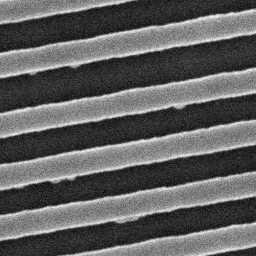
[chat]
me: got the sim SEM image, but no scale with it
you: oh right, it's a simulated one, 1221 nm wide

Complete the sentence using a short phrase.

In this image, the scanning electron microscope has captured lines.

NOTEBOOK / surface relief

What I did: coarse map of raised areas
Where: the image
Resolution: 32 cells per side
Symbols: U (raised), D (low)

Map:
UUUUUUUUUUUUUUDDDDDDDDDDDDDDDDDD
UUUUUUUUUDDDDDDDDDDDDDDDDDDDDDUU
UUUDDDDDDDDDDDDDDDDDDDDDUUUUUUUU
DDDDDDDDDDDDDDDDDDUUUUUUUUUUUUUU
DDDDDDDDDDDDDUUUUUUUUUUUUUUUUUDD
DDDDDDDUUUUUUUUUUUUUUUUUDDDDDDDD
DUUUUUUUUUUUUUUUUUDDDDDDDDDDDDDD
UUUUUUUUUUUUDDDDDDDDDDDDDDDDDDDD
UUUUUUUDDDDDDDDDDDDDDDDDDDDDDDDD
UDDDDDDDDDDDDDDDDDDDDDDDDDUUUUUU
DDDDDDDDDDDDDDDDDDDDDUUUUUUUUUUU
DDDDDDDDDDDDDDDUUUUUUUUUUUUUUUUU
DDDDDDDDDDUUUUUUUUUUUUUUUUUDDDDD
DDDDUUUUUUUUUUUUUUUUUDDDDDDDDDDD
UUUUUUUUUUUUUUUDDDDDDDDDDDDDDDDD
UUUUUUUUUDDDDDDDDDDDDDDDDDDDDUUU
UUUUDDDDDDDDDDDDDDDDDDDDUUUUUUUU
DDDDDDDDDDDDDDDDDDDUUUUUUUUUUUUU
DDDDDDDDDDDDUUUUUUUUUUUUUUUUUDDD
DDDDDDDUUUUUUUUUUUUUUUUDDDDDDDDD
DUUUUUUUUUUUUUUUUUDDDDDDDDDDDDDD
UUUUUUUUUUUUDDDDDDDDDDDDDDDDDDDD
UUUUUUUDDDDDDDDDDDDDDDDDDDUUUUUU
UDDDDDDDDDDDDDDDDDDDUUUUUUUUUUUU
DDDDDDDDDDDDDDDUUUUUUUUUUUUUUUUU
DDDDDDDDDUUUUUUUUUUUUUUUUUDDDDDD
DDDUUUUUUUUUUUUUUUUUDDDDDDDDDDDD
UUUUUUUUUUUUUUUUDDDDDDDDDDDDDDDD
UUUUUUUUUDDDDDDDDDDDDDDDDDDDUUUU
UUUDDDDDDDDDDDDDDDDDDDDUUUUUUUUU
DDDDDDDDDDDDDDDDDUUUUUUUUUUUUUUU
DDDDDDDDDDDUUUUUUUUUUUUUUUUUDDDD